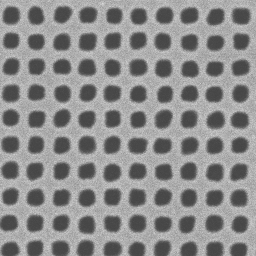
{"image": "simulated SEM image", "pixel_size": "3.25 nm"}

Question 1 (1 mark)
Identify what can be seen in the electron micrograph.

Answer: a regular array of holes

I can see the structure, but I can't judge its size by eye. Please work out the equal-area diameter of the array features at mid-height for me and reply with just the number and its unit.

54.5 nanometers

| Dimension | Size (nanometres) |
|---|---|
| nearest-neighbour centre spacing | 81.4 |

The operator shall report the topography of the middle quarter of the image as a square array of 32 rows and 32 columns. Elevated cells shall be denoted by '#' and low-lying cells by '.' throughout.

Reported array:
..##....##....###....##....###..
..#.....##....###....##....##...
.###....###...###...###....##...
################################
################################
.####..####.######.######.#####.
..##....##....###...####...###..
..##....##....###...###....##...
.###....##....###....##....##...
.#######################..######
################################
.########################.######
..##....##....###...###....###..
.###....##....###...###....##...
.###...###....###...###....##...
####...####..####...###...####..
################################
################################
.###...####...###..#############
.###....##....##.....##....###..
.###....##....##.....#.....##...
.###...###....##.....#.....##...
###########.############.#####.#
################################
################################
.###...####..####...###....###..
.###....##....##.....##....##...
.###....##....##....###....##...
####...###....###...###....###..
################################
################################
.####..####...###..#####..#####.